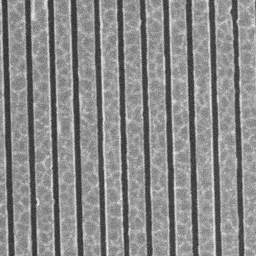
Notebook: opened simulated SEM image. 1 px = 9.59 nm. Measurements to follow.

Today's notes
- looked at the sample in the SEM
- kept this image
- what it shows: parallel lines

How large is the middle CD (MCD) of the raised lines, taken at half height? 161 nanometres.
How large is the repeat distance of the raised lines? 0.221 µm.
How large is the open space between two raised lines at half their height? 64.7 nm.